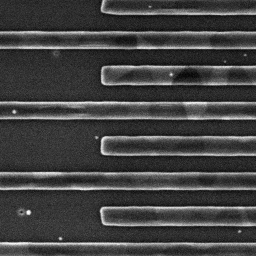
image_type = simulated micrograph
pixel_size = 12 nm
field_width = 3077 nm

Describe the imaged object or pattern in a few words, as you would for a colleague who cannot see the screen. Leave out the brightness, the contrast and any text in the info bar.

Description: wiring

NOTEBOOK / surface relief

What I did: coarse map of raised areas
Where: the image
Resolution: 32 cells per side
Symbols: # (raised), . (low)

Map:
.............###################
.............###################
................................
................................
################################
################################
................................
................................
.............###################
.............###################
.............##.################
................................
................................
################################
################################
................................
................................
.............###################
.............###################
................................
................................
................................
################################
################################
................................
................................
.............###################
.............###################
................................
................................
################################
################################